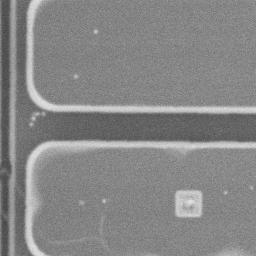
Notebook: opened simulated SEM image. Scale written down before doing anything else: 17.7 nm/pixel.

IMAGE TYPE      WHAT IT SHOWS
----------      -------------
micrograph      wiring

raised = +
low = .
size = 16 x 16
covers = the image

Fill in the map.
..++++++++++++++
..++++++++++++++
..++++++++++++++
..++++++++++++++
..++++++++++++++
..++++++++++++++
...+++++++++++++
................
................
..++++++++++++++
..++++++++++++++
..++++++++++++++
..++++++++++++++
..++++++++++++++
..++++++++++++++
..++++++++++++++